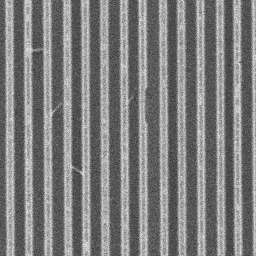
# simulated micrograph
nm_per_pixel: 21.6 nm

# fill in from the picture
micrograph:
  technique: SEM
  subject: parallel lines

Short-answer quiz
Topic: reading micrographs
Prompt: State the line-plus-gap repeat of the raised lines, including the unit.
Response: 411 nm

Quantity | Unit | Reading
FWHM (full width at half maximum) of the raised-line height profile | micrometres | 0.151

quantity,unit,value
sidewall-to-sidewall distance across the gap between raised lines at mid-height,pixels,12.3